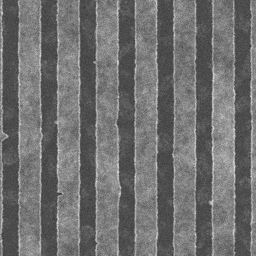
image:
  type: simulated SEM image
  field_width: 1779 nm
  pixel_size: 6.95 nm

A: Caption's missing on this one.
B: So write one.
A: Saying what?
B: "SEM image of parallel lines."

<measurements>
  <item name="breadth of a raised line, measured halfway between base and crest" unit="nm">152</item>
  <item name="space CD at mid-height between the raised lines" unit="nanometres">116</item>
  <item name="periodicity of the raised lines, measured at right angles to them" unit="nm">269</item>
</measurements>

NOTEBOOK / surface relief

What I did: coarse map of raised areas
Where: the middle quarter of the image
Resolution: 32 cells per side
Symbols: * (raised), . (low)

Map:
****....*****.....*****.....****
****....*****.....*****.....****
****....*****.....*****.....****
****....*****.....*****.....****
****....******....*****.....****
****....******....*****.....****
****....*****.....*****.....****
****....******....*****.....****
****....******....*****.....****
****....******....*****.....****
****....******....*****.....****
****....******....*****.....****
****....*****.....*****.....****
****....*****.....*****.....****
****....*****.....*****.....****
****....*****.....*****.....****
****....*****.....*****.....****
****....*****.....*****.....****
****....******....*****.....****
****....******....*****.....****
****....******....*****.....****
****....******....*****.....****
****....******....*****....*****
****....******....*****....*****
****....******....*****....*****
****....******....*****.....****
****....******....*****.....****
****....******....*****.....****
****....******....*****.....****
****....******....*****.....****
****....******....*****.....****
****....******....*****.....****